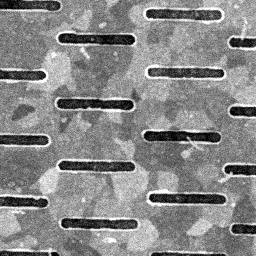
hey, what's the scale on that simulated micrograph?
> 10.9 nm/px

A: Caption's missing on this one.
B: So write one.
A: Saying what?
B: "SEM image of a regular array of holes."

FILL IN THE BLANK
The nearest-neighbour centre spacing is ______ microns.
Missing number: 0.655